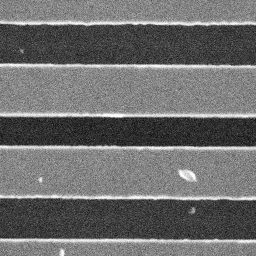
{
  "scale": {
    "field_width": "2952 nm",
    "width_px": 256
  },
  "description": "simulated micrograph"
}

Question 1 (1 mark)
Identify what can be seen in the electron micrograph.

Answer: lines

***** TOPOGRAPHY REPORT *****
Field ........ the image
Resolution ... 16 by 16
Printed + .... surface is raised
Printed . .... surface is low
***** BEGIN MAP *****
++++++++++++++++
.+++++++++++++++
................
................
++++++++++++++++
++++++++++++++++
++++++++++++++++
................
................
++++++++++++++++
++++++++++++++++
++++++++++++++++
................
................
................
++++++++++++++++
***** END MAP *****